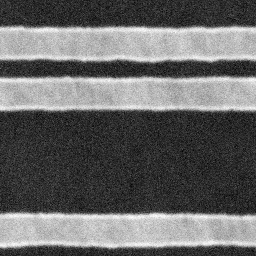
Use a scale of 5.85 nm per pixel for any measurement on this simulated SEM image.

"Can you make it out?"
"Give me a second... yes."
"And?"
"lines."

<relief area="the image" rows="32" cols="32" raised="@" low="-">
--------------------------------
--------------------------------
--------------------------------
--@-----------------------------
@@@@@@@@@@@@@@@@@@@@@@@@@@@@@@@@
@@@@@@@@@@@@@@@@@@@@@@@@@@@@@@@@
@@@@@@@@@@@@@@@@@@@@@@@@@@@@@@@@
-----------------@@@------------
--------------------------------
--------------------------------
@@@@@@@@@@@@@@@@@@@@@@@@@@@@@@@@
@@@@@@@@@@@@@@@@@@@@@@@@@@@@@@@@
@@@@@@@@@@@@@@@@@@@@@@@@@@@@@@@@
@@@@@@@@@@@@@@@@@@@@@@@@@@@@@@@@
--------------------------------
--------------------------------
--------------------------------
--------------------------------
--------------------------------
--------------------------------
--------------------------------
--------------------------------
--------------------------------
--------------------------------
--------------------------------
--------------------------------
--------------------------------
@@@@@@@@@@@@@@@@@@@@@@@@@@@@@@@@
@@@@@@@@@@@@@@@@@@@@@@@@@@@@@@@@
@@@@@@@@@@@@@@@@@@@@@@@@@@@@@@@@
@@@@@@@@@@@@@@@@@@@@@@@@@@@@@@@@
--------------------------------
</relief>